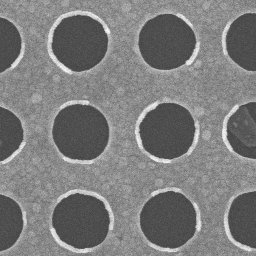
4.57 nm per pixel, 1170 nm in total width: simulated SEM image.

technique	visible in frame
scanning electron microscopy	holes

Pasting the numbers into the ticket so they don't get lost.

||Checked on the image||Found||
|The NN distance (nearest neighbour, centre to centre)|0.397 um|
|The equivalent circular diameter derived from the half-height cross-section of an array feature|0.258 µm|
